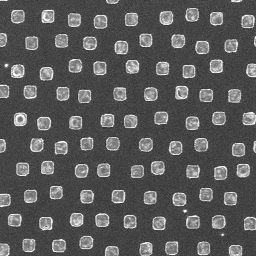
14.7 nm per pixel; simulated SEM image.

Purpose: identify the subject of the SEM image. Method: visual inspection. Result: a regular array of raised bodies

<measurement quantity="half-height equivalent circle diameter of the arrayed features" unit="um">0.2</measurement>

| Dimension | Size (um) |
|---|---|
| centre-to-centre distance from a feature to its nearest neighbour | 0.366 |